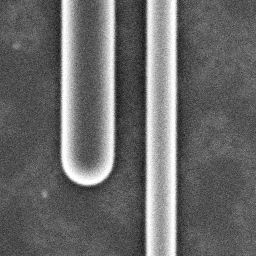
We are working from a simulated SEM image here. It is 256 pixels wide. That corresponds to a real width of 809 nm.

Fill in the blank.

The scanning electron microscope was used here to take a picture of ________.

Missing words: groups of lines, slits or small figures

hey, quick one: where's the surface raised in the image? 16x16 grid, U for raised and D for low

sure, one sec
DDDDUUUDDUUDDDDD
DDDDUUUDDUUDDDDD
DDDDUUUDDUUDDDDD
DDDDUUUDDUUDDDDD
DDDDUUUDDUUDDDDD
DDDDUUUDDUUDDDDD
DDDDUUUDDUUDDDDD
DDDDUUUDDUUDDDDD
DDDDUUUDDUUDDDDD
DDDDUUUDDUUDDDDD
DDDDUUUDDUUDDDDD
DDDDDDDDDUUDDDDD
DDDDDDDDDUUDDDDD
DDDDDDDDDUUDDDDD
DDDDDDDDDUUDDDDD
DDDDDDDDDUUDDDDD